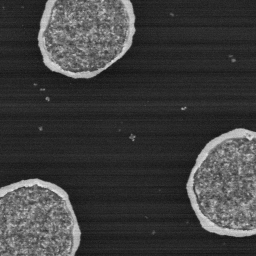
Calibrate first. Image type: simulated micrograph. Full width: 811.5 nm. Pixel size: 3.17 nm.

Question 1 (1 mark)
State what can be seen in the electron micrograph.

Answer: raised bodies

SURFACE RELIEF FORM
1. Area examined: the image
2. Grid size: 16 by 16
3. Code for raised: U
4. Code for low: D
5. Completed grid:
DDDUUUUUDDDDDDDD
DDDUUUUUDDDDDDDD
DDDUUUUUDDDDDDDD
DDDUUUUUDDDDDDDD
DDDDUUDDDDDDDDDD
DDDDDDDDDDDDDDDD
DDDDDDDDDDDDDDDD
DDDDDDDDDDDDDDDD
DDDDDDDDDDDDDDUU
DDDDDDDDDDDDDUUU
DDDDDDDDDDDDUUUU
DUUDDDDDDDDDUUUU
UUUUDDDDDDDDUUUU
UUUUUDDDDDDDUUUU
UUUUUDDDDDDDDDUU
UUUUUDDDDDDDDDDD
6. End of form